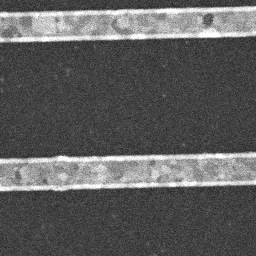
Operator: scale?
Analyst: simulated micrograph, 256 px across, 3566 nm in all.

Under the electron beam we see one or a few lines or trenches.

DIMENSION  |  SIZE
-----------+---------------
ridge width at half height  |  0.357 um